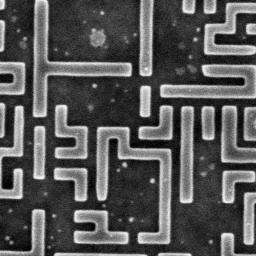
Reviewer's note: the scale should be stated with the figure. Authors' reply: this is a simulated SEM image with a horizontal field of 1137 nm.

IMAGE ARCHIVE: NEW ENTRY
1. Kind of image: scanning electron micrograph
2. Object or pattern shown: wiring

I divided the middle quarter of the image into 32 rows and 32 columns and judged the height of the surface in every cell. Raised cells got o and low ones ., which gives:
ooooooooooooooooo..ooo..........
ooooooooooooooooo..ooo..........
ooooooooooooooooo..ooo..........
................................
................................
........................ooo.....
...................oo...oooooooo
...................oo...oooooooo
...................oo...........
...................oo...........
...................oo...ooo.....
...................oo...ooo..ooo
...................oo...ooo..ooo
........................ooo..ooo
........................ooo..ooo
o......................oooo..ooo
oooooo..oooooooo...oooooooo..ooo
oooooo..oooooooo...oooooooo..ooo
..oooo..oooooooo...oooooooo..ooo
...ooo..ooo...oo.............ooo
...oo...ooo...oo.............ooo
oooooo..ooo...oooooooooooo...ooo
oooooo..ooo...ooooooooooooo..ooo
ooooo...ooo...ooooooooooooo..ooo
........ooo.............ooo..ooo
........ooo.............ooo..ooo
ooooo...ooo.............ooo..ooo
oooooo..ooo.............ooo..ooo
oooooo..ooo.............ooo..ooo
...ooo..ooo.............ooo..ooo
...ooo..ooo.............ooo..ooo
...ooo..ooo.............ooo..ooo